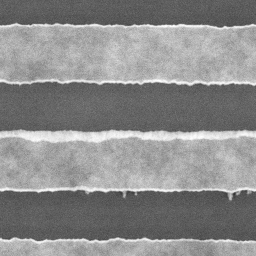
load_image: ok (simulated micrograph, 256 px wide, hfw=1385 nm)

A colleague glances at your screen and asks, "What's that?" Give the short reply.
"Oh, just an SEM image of lines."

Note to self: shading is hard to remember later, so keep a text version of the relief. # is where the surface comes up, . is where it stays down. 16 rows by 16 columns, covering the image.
................
................
################
################
################
................
................
................
################
################
################
################
................
................
................
################